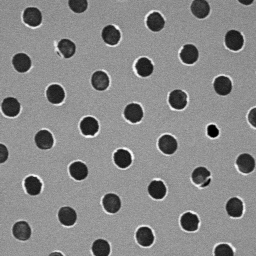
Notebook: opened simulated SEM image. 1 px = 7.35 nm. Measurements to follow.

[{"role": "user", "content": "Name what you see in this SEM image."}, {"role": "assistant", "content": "a regular array of holes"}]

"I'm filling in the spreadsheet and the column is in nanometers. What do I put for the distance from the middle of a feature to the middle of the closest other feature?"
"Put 338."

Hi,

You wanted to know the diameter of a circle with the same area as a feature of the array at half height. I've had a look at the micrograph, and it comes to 146 nanometres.